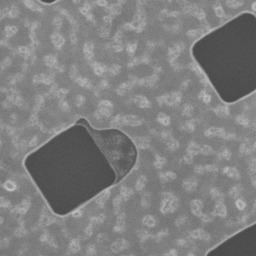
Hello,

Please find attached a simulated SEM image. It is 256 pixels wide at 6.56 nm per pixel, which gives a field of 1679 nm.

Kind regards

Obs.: holes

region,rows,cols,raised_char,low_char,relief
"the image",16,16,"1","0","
1111111111111111
1111111111111100
1111111111110000
1111111111110000
1111111111111000
1111111111111000
1111111111111111
1111111111111111
1110000011111111
1100000001111111
1100000011111111
1100000111111111
1110001111111111
1111111111111111
1111111111111110
1111111111111000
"